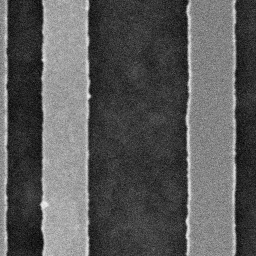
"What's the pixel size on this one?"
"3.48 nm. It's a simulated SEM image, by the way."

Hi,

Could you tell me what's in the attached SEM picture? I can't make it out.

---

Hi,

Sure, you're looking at lines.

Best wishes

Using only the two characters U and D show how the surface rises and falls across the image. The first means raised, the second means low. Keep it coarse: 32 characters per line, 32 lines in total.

UDDDDUUUUUUDDDDDDDDDDDDDUUUUUDDD
UDDDDUUUUUUDDDDDDDDDDDDUUUUUUDDD
UDDDDUUUUUUDDDDDDDDDDDDDUUUUUDDD
UDDDDUUUUUUDDDDDDDDDDDDDUUUUUDDD
UDDDDUUUUUUDDDDDDDDDDDDDUUUUUDDD
UDDDDUUUUUUDDDDDDDDDDDDDUUUUUDDD
UDDDDUUUUUUDDDDDDDDDDDDDUUUUUDDD
UDDDDUUUUUUDDDDDDDDDDDDDUUUUUDDD
UDDDDUUUUUUDDDDDDDDDDDDDUUUUUDDD
UDDDDUUUUUUDDDDDDDDDDDDDUUUUUDDD
UDDDDUUUUUUDDDDDDDDDDDDDUUUUUDDD
UDDDDUUUUUUDDDDDDDDDDDDDUUUUUDDD
UDDDDUUUUUUDDDDDDDDDDDDDUUUUUDDD
UDDDDUUUUUUDDDDDDDDDDDDUUUUUUDDD
UDDDDUUUUUUDDDDDDDDDDDDUUUUUUDDD
UDDDDUUUUUUDDDDDDDDDDDDUUUUUUDDD
UDDDDUUUUUUDDDDDDDDDDDDUUUUUUDDD
UDDDDUUUUUUDDDDDDDDDDDDUUUUUUDDD
UDDDDUUUUUUDDDDDDDDDDDDUUUUUUDDD
UDDDDUUUUUUDDDDDDDDDDDDUUUUUUDDD
UDDDDUUUUUUDDDDDDDDDDDDUUUUUUDDD
UDDDDUUUUUUDDDDDDDDDDDDDUUUUUDDD
UDDDDUUUUUUDDDDDDDDDDDDDUUUUUDDD
UDDDDUUUUUUDDDDDDDDDDDDDUUUUUDDD
UDDDDUUUUUUDDDDDDDDDDDDDUUUUUDDD
UDDDDUUUUUUDDDDDDDDDDDDDUUUUUDDD
UDDDDUUUUUUDDDDDDDDDDDDDUUUUUDDD
UDDDDUUUUUUDDDDDDDDDDDDUUUUUUDDD
UDDDDUUUUUUDDDDDDDDDDDDUUUUUUDDD
UDDDDUUUUUUDDDDDDDDDDDDUUUUUUDDD
UDDDDUUUUUUDDDDDDDDDDDDUUUUUUDDD
UDDDDUUUUUUDDDDDDDDDDDDUUUUUUDDD